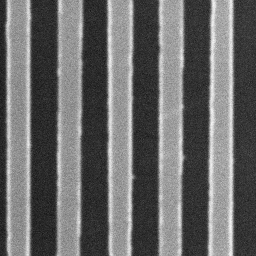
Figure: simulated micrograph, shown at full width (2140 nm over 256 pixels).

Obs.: lines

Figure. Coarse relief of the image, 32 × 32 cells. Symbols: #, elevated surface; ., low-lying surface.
.###...###....##....###....##...
.###...###....##....###....##...
.###...###....##....###...###...
.###...###....##....###...###...
.###...###....##....###...###...
.###...###....##....###...###...
.###...###....##....###...###...
.###...###....##....###...###...
.###...###....##....###...###...
.###...###....##....###...###...
.###...###....##....###...###...
.###...###....##....###...###...
.###...###....##....###...###...
.###...###....##....###...###...
.###...###....##....###...###...
.###...###....##....###...###...
.###...###....##....###...###...
.###...###....##....###...###...
.###...###....##....###...###...
.###...###....##....###...###...
.###...###....##....###...###...
.###...###....##....###...###...
.###...###....##....###...###...
.###...###....##....###...###...
.###...###....##....###...###...
.###...###....##....###...###...
.###...###....##....###...###...
.###...###....##....###...###...
.###...###....##....###...###...
.###...###....##....###...###...
.###...###....##....###...###...
.###...###....##....###...###...